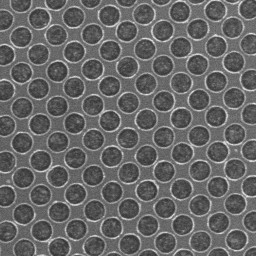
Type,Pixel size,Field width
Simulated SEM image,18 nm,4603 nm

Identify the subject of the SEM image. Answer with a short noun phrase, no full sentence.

a regular array of holes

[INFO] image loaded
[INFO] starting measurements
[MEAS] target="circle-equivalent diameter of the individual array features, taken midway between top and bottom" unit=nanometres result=376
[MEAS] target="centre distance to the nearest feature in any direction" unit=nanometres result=436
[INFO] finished